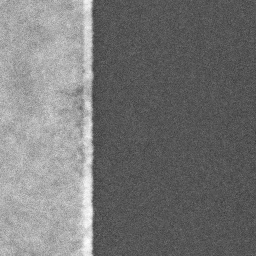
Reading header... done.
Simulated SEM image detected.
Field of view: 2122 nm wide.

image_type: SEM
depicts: one or a few lines or trenches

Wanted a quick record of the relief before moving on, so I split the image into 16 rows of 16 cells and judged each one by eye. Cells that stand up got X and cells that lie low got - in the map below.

XXXXXX----------
XXXXXX----------
XXXXXX----------
XXXXXX----------
XXXXXX----------
XXXXXX----------
XXXXX-----------
XXXXXX----------
XXXXXX----------
XXXXXX----------
XXXXXX----------
XXXXXX----------
XXXXXX----------
XXXXXX----------
XXXXXX----------
XXXXX-----------